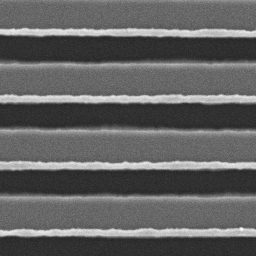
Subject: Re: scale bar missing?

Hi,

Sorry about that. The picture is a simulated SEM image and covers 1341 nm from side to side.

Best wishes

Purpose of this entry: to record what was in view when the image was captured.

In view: lines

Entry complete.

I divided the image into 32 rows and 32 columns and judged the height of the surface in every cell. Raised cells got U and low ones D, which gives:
UUUUUUUUUUUUUUUUUUUUUUUUUUUUUUUU
UUUUUUUUUUUUUUUUUUUUUUUUUUUUUUUU
UUUUUUUUUUUUUUUUUUUUUUUUUUUUUUUU
UUUUUUUUUUUUUUUUUUUUUUUUUUUUUUUU
DDDDDDDDDDDDDDDDDDDUUUUUUUUUUUUU
DDDDDDDDDDDDDDDDDDDDDDDDDDDDDDDD
DDDDDDDDDDDDDDDDDDDDDDDDDDDDDDDD
DDDDDDDDDDDDDDDDDDDDDDDDDDDDDDDD
UUUUUUUUUUUUUUUUUUUUUUUUUUUUUUUU
UUUUUUUUUUUUUUUUUUUUUUUUUUUUUUUU
UUUUUUUUUUUUUUUUUUUUUUUUUUUUUUUU
UUUUUUUUUUUUUUUUUUUUUUUUUUUUUUUU
UUUUUUUUUUUUUUUUUUUUUUUUUUUUUUUU
DDDDDDDDDDDDDDDDDDDDDDDDDDDDDDDD
DDDDDDDDDDDDDDDDDDDDDDDDDDDDDDDD
DDDDDDDDDDDDDDDDDDDDDDDDDDDDDDDD
UUUUUUUUUUUUUUUUUUUUUUUUUUUUUUUU
UUUUUUUUUUUUUUUUUUUUUUUUUUUUUUUU
UUUUUUUUUUUUUUUUUUUUUUUUUUUUUUUU
UUUUUUUUUUUUUUUUUUUUUUUUUUUUUUUU
UUUUUUUUUUUUUUUUUUUUUUUUUUUUUUUU
DDDDDDDDDDDDDDDDDDDDDDDDDDDDDDDD
DDDDDDDDDDDDDDDDDDDDDDDDDDDDDDDD
DDDDDDDDDDDDDDDDDDDDDDDDDDDDDDDD
DDDDDDDDDDDDDDDDDDDDDDDDDDDDDDDD
UUUUUUUUUUUUUUUUUUUUUUUUUUUUUUUU
UUUUUUUUUUUUUUUUUUUUUUUUUUUUUUUU
UUUUUUUUUUUUUUUUUUUUUUUUUUUUUUUU
UUUUUUUUUUUUUUUUUUUUUUUUUUUUUUUU
DDDDDDDDDDDDDDDDDDDUDDDUDDDDDDDD
DDDDDDDDDDDDDDDDDDDDDDDDDDDDDDDD
DDDDDDDDDDDDDDDDDDDDDDDDDDDDDDDD